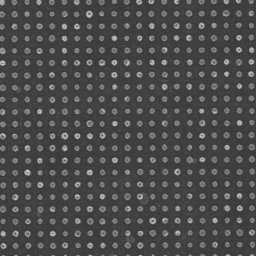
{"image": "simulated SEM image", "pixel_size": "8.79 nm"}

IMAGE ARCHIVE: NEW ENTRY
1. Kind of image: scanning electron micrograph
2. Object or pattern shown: a regular array of raised bodies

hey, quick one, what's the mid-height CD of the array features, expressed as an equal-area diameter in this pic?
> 0.0486 µm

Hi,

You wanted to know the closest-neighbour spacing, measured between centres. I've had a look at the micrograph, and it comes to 106 nanometers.